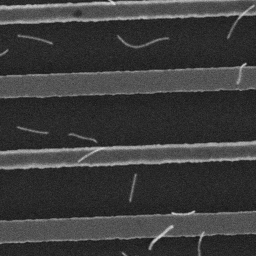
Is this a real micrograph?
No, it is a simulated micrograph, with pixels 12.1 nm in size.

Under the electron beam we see lines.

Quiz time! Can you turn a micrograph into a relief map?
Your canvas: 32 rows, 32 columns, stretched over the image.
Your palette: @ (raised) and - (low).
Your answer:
----------@@@@@@@@@@@@@@@@@@@@@@
@@@@@@@@@@@@@@@@@@@@@@@@@@@@@@@@
@@@@@@@@@@@@@@------------------
--------------------------------
--------------------------------
--------------------------------
--------------------------------
--------------------------------
---------------------------@@@@@
@@@@@@@@@@@@@@@@@@@@@@@@@@@@@@@@
@@@@@@@@@@@@@@@@@@@@@@@@@@@@@@@@
@@@@@@@@@@@@@@@@@@@@@-----------
--------------------------------
--------------------------------
--------------------------------
--------------------------------
--------------------------------
--------------------------------
------------@@@@@@@@@@@@@@@@@@@@
@@@@@@@@@@@@@@@@@@@@@@@@@@@@@@@@
@@@@@@@@@@@@@@@@----------------
--------------------------------
--------------------------------
--------------------------------
--------------------------------
--------------------------------
------------------------------@@
---@@@@@@@@@@@@@@@@@@@@@@@@@@@@@
@@@@@@@@@@@@@@@@@@@@@@@@@@@@@@@@
@@@@@@@@@@@@@@@@@@@@@@@@-@------
--------------------------------
--------------------------------